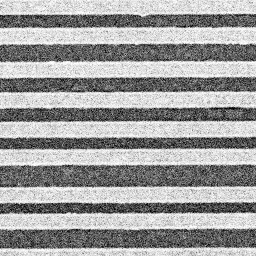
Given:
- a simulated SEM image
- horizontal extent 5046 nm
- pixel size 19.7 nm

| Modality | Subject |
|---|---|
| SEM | parallel lines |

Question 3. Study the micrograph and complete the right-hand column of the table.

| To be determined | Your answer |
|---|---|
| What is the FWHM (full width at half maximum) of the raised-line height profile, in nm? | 271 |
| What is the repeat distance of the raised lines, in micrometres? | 0.608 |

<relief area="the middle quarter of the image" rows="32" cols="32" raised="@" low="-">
@@@@@@@@@@@@@@@@@@@@@@@@@@@@@@@@
@@@@@@@@@@@@@@@@@@@@@@@@@@@@@@@@
@@@@@@@@@@@@@@@@@@@@@@@@@@@@@@@@
--------------------------------
--------------------------------
--------------------------------
--------------------------------
@@@@@@@@@@@@@@@@@@@@@@@@@@@@@@@@
@@@@@@@@@@@@@@@@@@@@@@@@@@@@@@@@
@@@@@@@@@@@@@@@@@@@@@@@@@@@@@@@@
@@@@@@@@@@@@@@@@@@@@@@@@@@@@@@@@
--------------------------------
--------------------------------
--------------------------------
--------------------------------
@@@@@@@@@@@@@@@@@@@@@@@@@@@@@@@@
@@@@@@@@@@@@@@@@@@@@@@@@@@@@@@@@
@@@@@@@@@@@@@@@@@@@@@@@@@@@@@@@@
--------------------------------
--------------------------------
--------------------------------
--------------------------------
@@@@@@@@@@@@@@@@@@@@@@@@@@@@@@@@
@@@@@@@@@@@@@@@@@@@@@@@@@@@@@@@@
@@@@@@@@@@@@@@@@@@@@@@@@@@@@@@@@
--------------------------------
--------------------------------
--------------------------------
--------------------------------
--------------------------------
--------------------------------
@@@@@@@@@@@@@@@@@@@@@@@@@@@@@@@@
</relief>